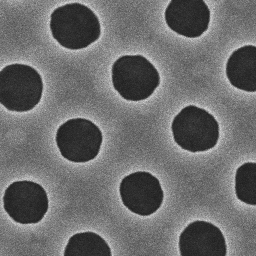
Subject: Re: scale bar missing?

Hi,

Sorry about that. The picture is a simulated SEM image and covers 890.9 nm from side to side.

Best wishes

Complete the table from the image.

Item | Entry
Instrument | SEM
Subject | holes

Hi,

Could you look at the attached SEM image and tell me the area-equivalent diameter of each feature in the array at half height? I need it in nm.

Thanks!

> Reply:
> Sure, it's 160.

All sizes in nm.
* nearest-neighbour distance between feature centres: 281